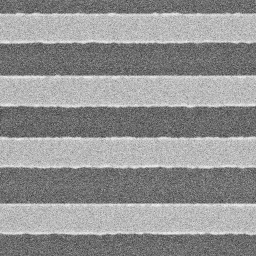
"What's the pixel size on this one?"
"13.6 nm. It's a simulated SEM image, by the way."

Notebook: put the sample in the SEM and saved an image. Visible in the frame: lines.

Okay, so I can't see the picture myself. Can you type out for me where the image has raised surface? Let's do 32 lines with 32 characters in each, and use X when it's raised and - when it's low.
--------------------------------
--------------------------------
XXXXXXXXXXXXXXXXXXXXXXXXXXXXXXXX
XXXXXXXXXXXXXXXXXXXXXXXXXXXXXXXX
XXXXXXXXXXXXXXXXXXXXXXXXXXXXXXXX
--------------------------------
--------------------------------
--------------------------------
--------------------------------
-------X------------------------
XXXXXXXXXXXXXXXXXXXXXXXXXXXXXXXX
XXXXXXXXXXXXXXXXXXXXXXXXXXXXXXXX
XXXXXXXXXXXXXXXXXXXXXXXXXXXXXXXX
--------------------------------
--------------------------------
--------------------------------
--------------------------------
XXXXXXXXXXXXXXXXXXXXXXXXXXXXXXXX
XXXXXXXXXXXXXXXXXXXXXXXXXXXXXXXX
XXXXXXXXXXXXXXXXXXXXXXXXXXXXXXXX
XXXXXXXXXXXXXXXXXXXXXXXXXXXXXXXX
--------------------------------
--------------------------------
--------------------------------
--------------------------------
--------------------------------
XXXXXXXXXXXXXXXXXXXXXXXXXXXXXXXX
XXXXXXXXXXXXXXXXXXXXXXXXXXXXXXXX
XXXXXXXXXXXXXXXXXXXXXXXXXXXXXXXX
--------------------------------
--------------------------------
--------------------------------